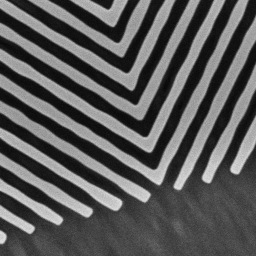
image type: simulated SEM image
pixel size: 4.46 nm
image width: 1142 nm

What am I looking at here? groups of lines, slits or small figures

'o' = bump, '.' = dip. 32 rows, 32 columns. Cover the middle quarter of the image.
o......ooooo.....ooo...ooo....oo
ooo......ooooo...oo....ooo...ooo
ooooo.....ooooooooo...ooo...ooo.
..oooo......ooooooo...ooo...ooo.
...oooo.......oooo...ooo....oo..
.....oooo......ooo...ooo...ooo..
o......oooo.........ooo....oo...
oo......oooo........ooo...ooo...
oooo......oooo.....ooo....oo....
.ooooo.....oooooo..ooo...ooo...o
..ooooo......oooooooo....oo....o
....ooooo......oooooo...ooo...oo
......ooooo.....oooo....oo....oo
o......ooooo......oo...ooo...ooo
ooo......ooooo.........ooo...ooo
ooooo.....ooooo.......ooo....oo.
..oooo......ooooo.....ooo...ooo.
...ooooo.....oooooo..ooo....oo..
.....oooo......oooooooo....ooo..
.......oooo......oooooo...ooo...
oo......oooo......ooooo...ooo...
oooo......oooo......oo...ooo....
.oooo.......oooo.........ooo...o
...oooo......ooooo......ooo....o
....oooo.......oooo.....oo....oo
......oooo......oooo....oo....oo
o......oooo.......oooo.ooo...ooo
ooo......oooo.......ooooo....ooo
oooo.......oooo......oooo....oo.
..oooo......ooooo.....oo....oo..
....ooo.......ooooo.........oo..
.....oooo......ooooo............